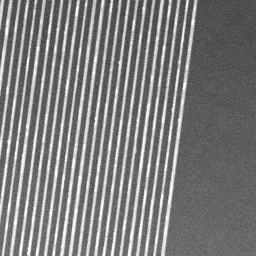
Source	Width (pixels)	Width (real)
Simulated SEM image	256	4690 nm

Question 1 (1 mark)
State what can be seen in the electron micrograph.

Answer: parallel lines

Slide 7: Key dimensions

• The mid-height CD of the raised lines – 0.0386 micrometres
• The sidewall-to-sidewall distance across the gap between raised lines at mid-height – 114 nanometres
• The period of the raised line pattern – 0.153 micrometres